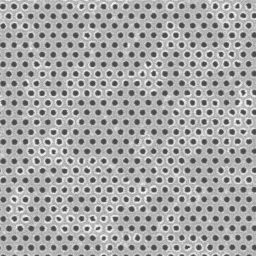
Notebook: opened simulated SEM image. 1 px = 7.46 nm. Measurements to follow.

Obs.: a regular array of holes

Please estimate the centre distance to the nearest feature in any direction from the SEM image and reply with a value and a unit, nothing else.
10.8 px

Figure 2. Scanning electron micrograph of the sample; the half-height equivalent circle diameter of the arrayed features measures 42.9 nm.